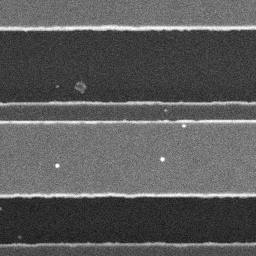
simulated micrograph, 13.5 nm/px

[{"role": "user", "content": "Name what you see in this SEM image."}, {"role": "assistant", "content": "lines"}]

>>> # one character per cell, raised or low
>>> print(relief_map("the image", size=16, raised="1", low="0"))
1111111111111111
1111111111111111
0000000000000000
0000000000000000
0000000000000000
0000000000000000
0000000000000000
0000000000000000
1111111111111111
1111111111111111
1111111111111111
1111111111111111
0000000000000000
0000000000000000
0000000000000000
0000000000000000